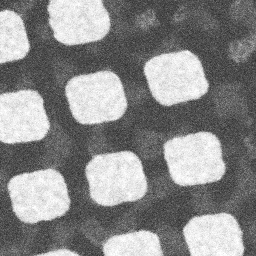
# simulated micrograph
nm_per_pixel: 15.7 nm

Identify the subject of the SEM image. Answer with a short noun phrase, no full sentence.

raised bodies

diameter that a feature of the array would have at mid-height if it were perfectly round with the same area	0.882	um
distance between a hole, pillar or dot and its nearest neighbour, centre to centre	1270	nanometers